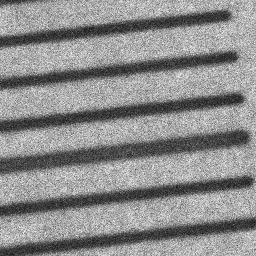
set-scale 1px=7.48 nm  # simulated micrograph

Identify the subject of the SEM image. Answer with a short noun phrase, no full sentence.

parallel lines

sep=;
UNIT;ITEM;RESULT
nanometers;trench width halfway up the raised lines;84.5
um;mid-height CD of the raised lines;0.232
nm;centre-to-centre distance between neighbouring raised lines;314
